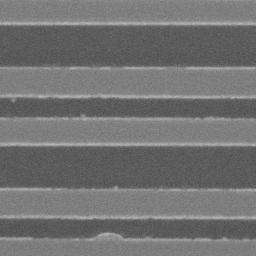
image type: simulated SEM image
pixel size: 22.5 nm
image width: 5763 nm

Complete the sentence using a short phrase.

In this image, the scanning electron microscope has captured lines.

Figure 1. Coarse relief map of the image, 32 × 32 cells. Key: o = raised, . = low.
oooooooooooooooooooooooooooooooo
oooooooooooooooooooooooooooooooo
oooooooooooooooooooooooooooooooo
................................
................................
................................
................................
................................
................................
oooooooooooooooooooooooooooooooo
oooooooooooooooooooooooooooooooo
oooooooooooooooooooooooooooooooo
................................
................................
................................
oooooooooooooooooooooooooooooooo
oooooooooooooooooooooooooooooooo
oooooooooooooooooooooooooooooooo
................................
................................
................................
................................
................................
................................
oooooooooooooooooooooooooooooooo
oooooooooooooooooooooooooooooooo
oooooooooooooooooooooooooooooooo
................................
................................
............ooo.................
oooooooooooooooooooooooooooooooo
oooooooooooooooooooooooooooooooo